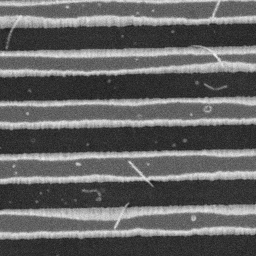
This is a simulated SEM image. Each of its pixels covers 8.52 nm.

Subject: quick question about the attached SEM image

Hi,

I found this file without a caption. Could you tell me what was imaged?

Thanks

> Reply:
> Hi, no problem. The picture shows lines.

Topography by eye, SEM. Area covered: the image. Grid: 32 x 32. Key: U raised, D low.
UUUUUUUUUUUUUUUUUUUUUUUUUUUUUUUU
UUUUUUUUUUUUUUUUUUUUUUUUUUUUUUUU
UUUUUUUUUUUUUUUUUUUUUUUUUUUUUUUU
DDDDDDDDDDDDDDDDDDDDDDDDDDDDDDDD
DDDDDDDDDDDDDDDDDDDDDDDDDDDDDDDD
DDDDDDDDDDDDDDDDDDDDDDDDDDDDDDDD
DDDDDDDDDDDDDUUUUUUUUUUUUUUUUUUU
UUUUUUUUUUUUUUUUUUUUUUUUUUUUUUUU
UUUUUUUUUUUUUUUUUUUUUUUUUUUUUUUU
DDDDDDDDDDDDDDDDDDDDDDDDDDDDDDDD
DDDDDDDDDDDDDDDDDDDDDDDDDDDDDDDD
DDDDDDDDDDDDDDDDDDDDDDDDDDDDDDDD
DDDDDDDDDDDDDDDDDDDDDUUUUUUUUUUU
UUUUUUUUUUUUUUUUUUUUUUUUUUUUUUUU
UUUUUUUUUUUUUUUUUUUUUUUUUUUUUUUU
UUUUUUUUUUUUUUUUUUUUUUUUDDDDDDDD
DDDDDDDDDDDDDDDDDDDDDDDDDDDDDDDD
DDDDDDDDDDDDDDDDDDDDDDDDDDDDDDDD
DDDDDDDDDDDDDDDDDDDDDDDDDDDDDDDD
DDDUUUUUUUUUUUUUUUUUUUUUUUUUUUUU
UUUUUUUUUUUUUUUUUUUUUUUUUUUUUUUU
UUUUUUUUUUUUUUUUUUUUUUUUUUUUUUUU
UUUUUUUUUUUUUDUUUDUDDDDDDDDDDDDD
DDDDDDDDDDDDDDDDDDDDDDDDDDDDDDDD
DDDDDDDDDDDDDDDDDDDDDDDDDDDDDDDD
DDDDDDDDDDDDDDDDDDDDDDDDDDDDDDDD
UUUUUUUUUDDDDDUUUUUUUUUUUUUUUUUU
UUUUUUUUUUUUUUUUUUUUUUUUUUUUUUUU
UUUUUUUUUUUUUUUUUUUUUUUUUUUUUUUU
UUUUUUUUDUUDDDDDDDDDDDDDDDDDDDDD
DDDDDDDDDDDDDDDDDDDDDDDDDDDDDDDD
DDDDDDDDDDDDDDDDDDDDDDDDDDDDDDDD